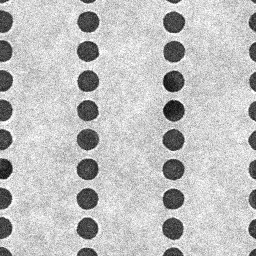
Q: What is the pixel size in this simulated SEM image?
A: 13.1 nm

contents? a regular array of holes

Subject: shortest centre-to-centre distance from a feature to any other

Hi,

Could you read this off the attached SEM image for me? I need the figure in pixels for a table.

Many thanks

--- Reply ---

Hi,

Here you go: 29.4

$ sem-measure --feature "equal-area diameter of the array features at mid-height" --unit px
22.3